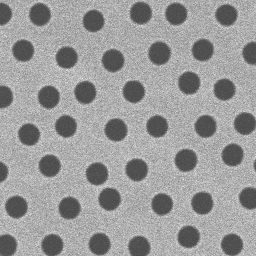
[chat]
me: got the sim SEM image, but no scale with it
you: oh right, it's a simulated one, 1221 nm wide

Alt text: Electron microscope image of a regular array of holes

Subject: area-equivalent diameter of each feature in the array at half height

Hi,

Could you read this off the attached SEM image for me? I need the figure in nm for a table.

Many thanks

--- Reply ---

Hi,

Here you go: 102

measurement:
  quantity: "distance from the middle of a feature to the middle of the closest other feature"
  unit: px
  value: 37.5